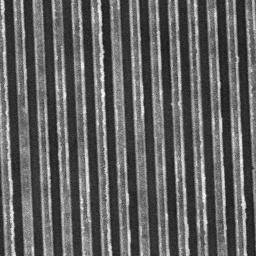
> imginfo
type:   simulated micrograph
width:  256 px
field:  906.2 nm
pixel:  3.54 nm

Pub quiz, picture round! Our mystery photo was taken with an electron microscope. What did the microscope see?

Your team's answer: parallel lines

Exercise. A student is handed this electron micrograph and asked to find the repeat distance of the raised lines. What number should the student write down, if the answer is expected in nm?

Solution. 68.4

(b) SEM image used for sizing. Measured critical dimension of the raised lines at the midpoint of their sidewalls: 33.6 nm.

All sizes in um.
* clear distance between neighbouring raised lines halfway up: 0.0341